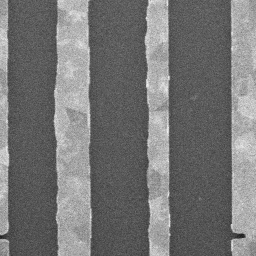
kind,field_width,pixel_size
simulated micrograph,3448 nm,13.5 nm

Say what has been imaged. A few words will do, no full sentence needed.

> one or a few lines or trenches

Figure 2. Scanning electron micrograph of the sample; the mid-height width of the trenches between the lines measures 797 nanometres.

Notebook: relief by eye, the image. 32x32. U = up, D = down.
UDDDDDDUUUUDDDDDDDDUUDDDDDDDDUUU
UDDDDDDUUUUDDDDDDDUUUDDDDDDDDUUU
UDDDDDDUUUUDDDDDDDUUUDDDDDDDDUUU
UDDDDDDUUUUDDDDDDDUUUDDDDDDDDUUU
UDDDDDDUUUUDDDDDDDUUUDDDDDDDDUUU
UDDDDDDUUUUDDDDDDDUUUDDDDDDDDUUU
UDDDDDDUUUUDDDDDDDUUUDDDDDDDDUUU
UDDDDDDUUUUDDDDDDDUUUDDDDDDDDUUU
UDDDDDDUUUUDDDDDDDDUUDDDDDDDDUUU
UDDDDDDUUUUDDDDDDDUUUDDDDDDDDUUU
UDDDDDDUUUUDDDDDDDUUUDDDDDDDDUUU
UDDDDDDUUUUDDDDDDDUUUDDDDDDDDUUU
UDDDDDDUUUUDDDDDDDUUUDDDDDDDDUUU
UDDDDDDUUUUDDDDDDDDUUDDDDDDDDUUU
UDDDDDDUUUUDDDDDDDDUUDDDDDDDDUUU
UDDDDDDUUUUDDDDDDDDUUDDDDDDDDUUU
UDDDDDDUUUUDDDDDDDDUUDDDDDDDDUUU
UDDDDDDUUUUDDDDDDDDUUDDDDDDDDUUU
UDDDDDDUUUUDDDDDDDUUUDDDDDDDDUUU
UDDDDDDUUUUDDDDDDDUUUDDDDDDDDUUU
UDDDDDDUUUUDDDDDDDDUUDDDDDDDDUUU
UDDDDDDUUUUDDDDDDDUUUDDDDDDDDUUU
UDDDDDDUUUUDDDDDDDUUUDDDDDDDDUUU
UDDDDDDUUUUDDDDDDDDUUDDDDDDDDUUU
UDDDDDDUUUUDDDDDDDDUUDDDDDDDDUUU
UDDDDDDUUUUDDDDDDDDUUDDDDDDDDUUU
UDDDDDDUUUUDDDDDDDDUUDDDDDDDDUUU
UDDDDDDUUUUDDDDDDDDUUDDDDDDDDUUU
UDDDDDDUUUUDDDDDDDDUUDDDDDDDDUUU
DDDDDDDUUUUDDDDDDDDUUDDDDDDDDDUU
UDDDDDDUUUUDDDDDDDDUUDDDDDDDDUUU
UDDDDDDUUUUDDDDDDDDUUDDDDDDDDUUU